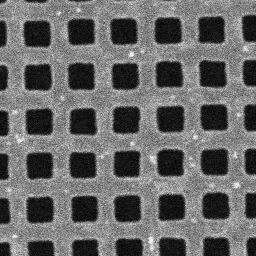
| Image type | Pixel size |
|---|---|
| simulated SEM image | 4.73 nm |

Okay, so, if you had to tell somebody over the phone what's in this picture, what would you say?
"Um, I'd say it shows a regular array of holes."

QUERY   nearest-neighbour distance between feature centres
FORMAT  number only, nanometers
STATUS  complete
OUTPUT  205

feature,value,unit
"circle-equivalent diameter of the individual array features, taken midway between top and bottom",0.142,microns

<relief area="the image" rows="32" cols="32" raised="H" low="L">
HHHHHHHHHHHHHHHHHHHHHHHHHHHHHHHH
HHHHHHHHHHHHHHHHHHHHHHHHHHHHHHHH
HHHHLHHHHLLLHHLLLHHHLLHHHLLLHHLL
LHHLLLHHLLLLHHLLLHHLLLLHHLLLHHLL
LHHLLLHHLLLLHHLLLHHLLLLHHLLLHHLL
LHHLLLHHHLLHHHLLLHHHLLHHHHHHHHHH
HHHHHHHHHHHHHHHHHHHHHHHHHHHHHHHH
HHHHHHHHHHHHHHHHHHHHHHHHHHHHHHHH
LHHLLLHHLLLLHHLLLHHLLLLHHLLLHHLL
LHHLLLHHLLLLHHLLLHHLLLLHHLLLHHLL
LHHLLLHHHLLLHHLLLHHHLLLHHLLLHHHL
HHHHHHHHHHHHHHHHHHHHHHHHHHHHHHHH
HHHHHHHHHHHHHHHHHHHHHHHHHHHHHHHH
HHHHHLHHHHLHHHHLLHHHLLLHHLLLHHHL
LHHLLLLHHLLLHHLLLLHHLLLHHLLLHHLL
LHHLLLLHHLLLHHLLLHHHLLLHHLLLLHLL
LHHLLLLHHLLLHHLLLHHHLHHHHHHHHHHL
HHHHHHHHHHHHHHHHHHHHHHHHHHHHHHHH
HHHHHHHHHHHHHHHHHHHHHHHHHHHHHHHH
LHHLLLLHHLLLHHLLLLHHLLLHHLLLLHHL
LHHLLLLHHLLLHHLLLLHHLLLHHLLLLHHL
LHHLLLLHHLLLHHLLLLHHLLLHHLLLHHHL
LHHHHHHHHHHHHHHHHHHHHHHHHHHHHHHH
HHHHHHHHHHHHHHHHHHHHHHHHHHHHHHHH
HHHHHHHHHHLLHHHLLHHHLLLHHLLLHHHL
LHHLLLLHHLLLHHLLLLHHLLLHHLLLLHHL
LHHLLLLHHLLLHHLLLLHHLLLHHLLLLHHL
LHHLLLLHHLLLHHHLLHHHLLHHHHHLHHHH
HHHHHHHHHHHHHHHHHHHHHHHHHHHHHHHH
HHHHHHHHHHHHHHHHHHHHHHHHHHHHHHHH
LHHLLLLHHLLLHHLLLLHHLLLHHLLLLHHL
LHHLLLLHHLLLHHLLLLHHLLLHHLLLLHHL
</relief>